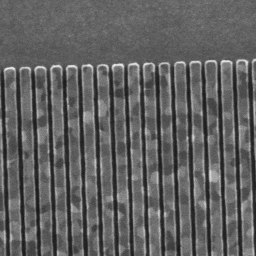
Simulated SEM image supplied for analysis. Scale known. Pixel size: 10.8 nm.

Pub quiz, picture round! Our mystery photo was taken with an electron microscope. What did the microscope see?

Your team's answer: parallel lines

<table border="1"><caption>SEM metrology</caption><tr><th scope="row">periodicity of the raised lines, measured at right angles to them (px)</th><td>15.5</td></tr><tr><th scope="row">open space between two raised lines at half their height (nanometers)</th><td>41.8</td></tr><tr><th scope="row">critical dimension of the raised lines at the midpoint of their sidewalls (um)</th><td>0.124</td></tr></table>